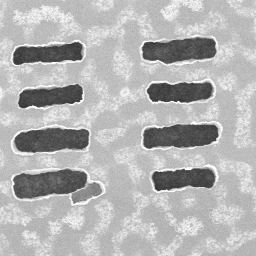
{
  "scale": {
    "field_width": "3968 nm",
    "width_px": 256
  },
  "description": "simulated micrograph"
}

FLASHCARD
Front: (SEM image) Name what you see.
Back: a regular array of holes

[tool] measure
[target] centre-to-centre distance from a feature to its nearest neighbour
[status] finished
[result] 665 nm